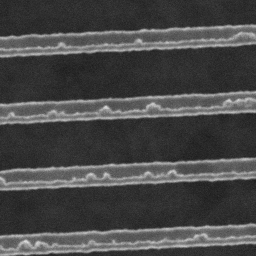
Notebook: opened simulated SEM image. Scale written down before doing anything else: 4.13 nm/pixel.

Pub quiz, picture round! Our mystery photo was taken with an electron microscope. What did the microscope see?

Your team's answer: lines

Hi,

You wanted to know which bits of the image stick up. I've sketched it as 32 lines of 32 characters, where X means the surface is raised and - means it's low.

--------------------------------
--------------------------------
--------------------------------
------------------------XXXXXXXX
---XXXXXXXXXXXXXXXXXXXXXXXXXXXXX
XXXXXXXXXXXXXXXXXXXXXXXXXXXXXXXX
XXXXXXXXXX----------------------
--------------------------------
--------------------------------
--------------------------------
--------------------------------
--------------------------------
------------XXXXXXXXXXXXXXXXXXXX
XXXXXXXXXXXXXXXXXXXXXXXXXXXXXXXX
XXXXXXXXXXXXXXXXXXXX------------
--------------------------------
--------------------------------
--------------------------------
--------------------------------
--------------------------------
-----------------XXXXXXXXXXXXXXX
XXXXXXXXXXXXXXXXXXXXXXXXXXXXXXXX
XXXXXXXXXXXXXXXXXXXXXXXXX-X-----
XXXXX---------------------------
--------------------------------
--------------------------------
--------------------------------
--------------------------------
----------------------XXXXXXXXXX
-XXXXXXXXXXXXXXXXXXXXXXXXXXXXXXX
XXXXXXXXXXXXXXXXXXXXXXXXXXXXX---
XXXXXXXX------------------------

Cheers